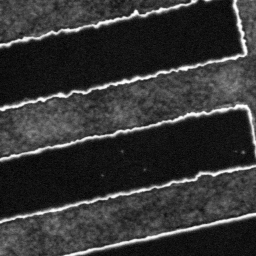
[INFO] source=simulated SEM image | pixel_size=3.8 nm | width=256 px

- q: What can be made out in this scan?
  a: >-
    one or a few lines or trenches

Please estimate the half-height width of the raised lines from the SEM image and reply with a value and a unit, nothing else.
238 nanometers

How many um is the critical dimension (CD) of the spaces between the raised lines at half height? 0.178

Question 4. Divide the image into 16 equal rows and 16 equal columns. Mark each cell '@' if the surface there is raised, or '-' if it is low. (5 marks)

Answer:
----------@@@@@-
------@@@@@@@@@-
-@@@@@@@@@@@@@@-
@@@@@@@@@@@@@@@-
@@@@@@@@@@@-----
@@@@@@----------
@@--------------
-----------@@@@@
------@@@@@@@@@@
--@@@@@@@@@@@@@@
@@@@@@@@@@@@@@@@
@@@@@@@@@@@-----
@@@@@@----------
@@-------------@
-----------@@@@@
------@@@@@@@@@@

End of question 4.